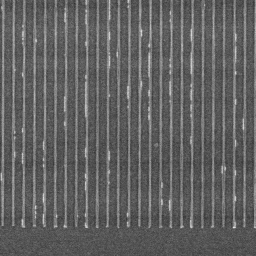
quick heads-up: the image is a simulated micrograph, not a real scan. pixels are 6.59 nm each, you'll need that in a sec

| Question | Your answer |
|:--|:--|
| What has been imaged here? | parallel lines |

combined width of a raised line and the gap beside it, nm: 69.3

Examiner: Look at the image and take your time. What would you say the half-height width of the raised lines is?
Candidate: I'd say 9.1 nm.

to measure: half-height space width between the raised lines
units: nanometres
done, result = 58.5